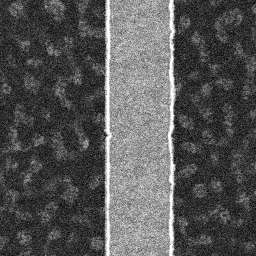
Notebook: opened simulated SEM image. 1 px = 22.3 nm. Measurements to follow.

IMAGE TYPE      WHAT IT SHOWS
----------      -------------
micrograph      one or a few lines or trenches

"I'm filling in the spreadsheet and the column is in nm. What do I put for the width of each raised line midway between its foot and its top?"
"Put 1400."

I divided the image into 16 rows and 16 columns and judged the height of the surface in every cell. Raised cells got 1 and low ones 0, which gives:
0000000111100000
0000000111100000
0000000111100000
0000000111100000
0000000111100000
0000000111100000
0000000111100000
0000000111100000
0000000111100000
0000000111100000
0000000111100000
0000000111100000
0000000111100000
0000000111100000
0000000111100000
0000000111100000